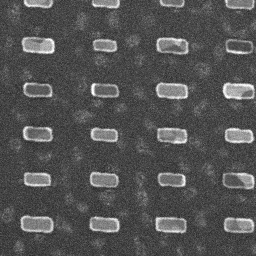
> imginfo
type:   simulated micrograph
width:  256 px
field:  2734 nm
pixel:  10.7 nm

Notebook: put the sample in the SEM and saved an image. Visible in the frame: a regular array of raised bodies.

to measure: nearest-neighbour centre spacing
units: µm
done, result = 0.476